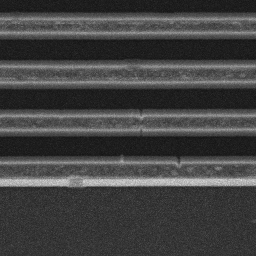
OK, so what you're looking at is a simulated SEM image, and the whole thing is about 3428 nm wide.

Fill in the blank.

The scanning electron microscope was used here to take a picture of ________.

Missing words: parallel lines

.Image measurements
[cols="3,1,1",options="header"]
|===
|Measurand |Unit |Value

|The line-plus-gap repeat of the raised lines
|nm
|648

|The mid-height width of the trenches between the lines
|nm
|375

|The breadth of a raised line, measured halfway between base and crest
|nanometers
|274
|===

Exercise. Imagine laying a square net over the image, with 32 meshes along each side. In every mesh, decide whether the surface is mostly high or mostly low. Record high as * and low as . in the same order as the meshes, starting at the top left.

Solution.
................................
................................
********************************
********************************
................................
................................
................................
................................
********************************
********************************
********************************
................................
................................
................................
********************************
********************************
********************************
................................
................................
................................
********************************
********************************
********************************
................................
................................
................................
................................
................................
................................
................................
................................
................................